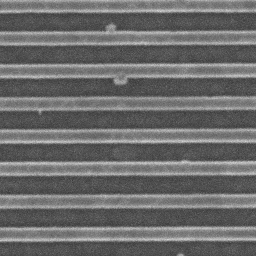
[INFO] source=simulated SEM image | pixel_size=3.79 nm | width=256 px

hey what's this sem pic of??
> parallel lines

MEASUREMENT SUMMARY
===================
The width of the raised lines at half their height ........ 46.5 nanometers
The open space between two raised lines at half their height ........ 76.8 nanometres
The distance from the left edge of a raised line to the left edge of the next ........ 124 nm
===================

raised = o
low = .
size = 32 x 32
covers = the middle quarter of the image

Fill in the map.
oooooooooooooooooooooooooooooooo
oooooooooooooooooooooooooooooooo
oooooooooooooooooooooooooooooooo
.............ooo................
.............ooo................
................................
................................
................................
..........................oooooo
oooooooooooooooooooooooooooooooo
oooooooooooooooooooooooooooooooo
................................
................................
................................
................................
................................
....................o...........
oooooooooooooooooooooooooooooooo
oooooooooooooooooooooooooooooooo
oo....oo........................
................................
................................
................................
................................
..............................o.
oooooooooooooooooooooooooooooooo
oooooooooooooooooooooooooooooooo
....ooooo.oooooooooooooooooooooo
................................
................................
................................
................................